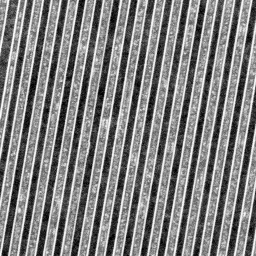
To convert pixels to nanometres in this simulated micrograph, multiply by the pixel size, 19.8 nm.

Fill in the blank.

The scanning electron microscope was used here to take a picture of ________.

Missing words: parallel lines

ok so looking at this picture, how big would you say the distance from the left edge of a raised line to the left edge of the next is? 339 nanometres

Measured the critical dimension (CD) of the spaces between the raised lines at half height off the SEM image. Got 169 nanometers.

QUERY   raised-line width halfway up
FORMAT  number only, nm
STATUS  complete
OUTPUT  169